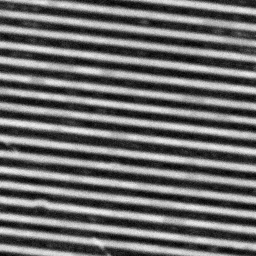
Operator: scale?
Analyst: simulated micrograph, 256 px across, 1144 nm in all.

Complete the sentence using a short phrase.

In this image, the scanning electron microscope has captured parallel lines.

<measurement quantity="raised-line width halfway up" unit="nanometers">24.4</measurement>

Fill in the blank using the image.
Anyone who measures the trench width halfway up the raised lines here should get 44.3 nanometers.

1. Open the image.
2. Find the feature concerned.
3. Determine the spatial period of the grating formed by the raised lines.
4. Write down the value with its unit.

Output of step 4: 69.2 nanometers